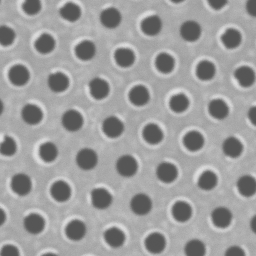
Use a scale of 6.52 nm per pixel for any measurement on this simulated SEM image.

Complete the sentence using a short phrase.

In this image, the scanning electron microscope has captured a regular array of holes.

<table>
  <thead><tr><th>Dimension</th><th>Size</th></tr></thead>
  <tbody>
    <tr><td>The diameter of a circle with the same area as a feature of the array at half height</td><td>0.139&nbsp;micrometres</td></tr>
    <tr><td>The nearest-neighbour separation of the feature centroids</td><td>0.262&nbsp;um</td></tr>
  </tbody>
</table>